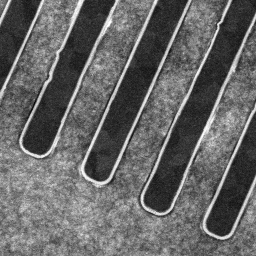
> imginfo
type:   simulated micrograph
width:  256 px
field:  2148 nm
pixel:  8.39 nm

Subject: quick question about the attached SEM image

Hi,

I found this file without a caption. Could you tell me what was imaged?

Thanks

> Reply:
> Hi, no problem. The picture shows one or a few lines or trenches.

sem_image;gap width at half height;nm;306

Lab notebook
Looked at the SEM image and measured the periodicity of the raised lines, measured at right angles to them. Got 555 nanometres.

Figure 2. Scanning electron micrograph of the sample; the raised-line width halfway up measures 254 nm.